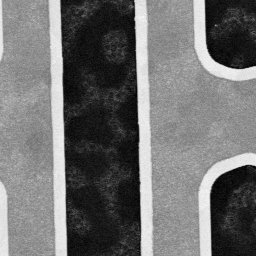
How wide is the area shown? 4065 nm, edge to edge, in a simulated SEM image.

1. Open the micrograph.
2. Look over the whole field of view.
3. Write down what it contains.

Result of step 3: one or a few lines or trenches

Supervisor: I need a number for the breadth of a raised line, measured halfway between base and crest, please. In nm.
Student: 945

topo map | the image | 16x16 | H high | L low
HHHLLLLLLHHHLLLL
HHHLLLLLLHHHLLLL
HHHLLLLLLHHHHLLL
HHHHLLLLLHHHHLLL
HHHHLLLLLHHHHHLL
HHHHLLLLLHHHHHHH
HHHHLLLLLHHHHHHH
HHHHLLLLLHHHHHHH
HHHHLLLLLHHHHHHH
HHHHLLLLLHHHHHHH
HHHHLLLLLHHHHHLL
HHHHLLLLLHHHHLLL
HHHHLLLLLHHHHLLL
HHHHLLLLLHHHHLLL
HHHHLLLLLHHHHLLL
HHHHLLLLLHHHHLLL